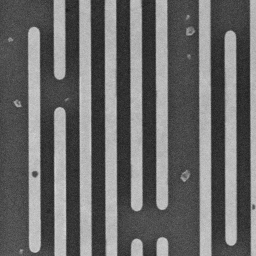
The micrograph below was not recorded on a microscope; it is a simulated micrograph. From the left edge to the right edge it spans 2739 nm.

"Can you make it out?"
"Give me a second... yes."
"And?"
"groups of lines, slits or small figures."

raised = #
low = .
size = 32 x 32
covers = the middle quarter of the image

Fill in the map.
....###...###....##....###......
....###...###....##....###......
....###...###....##....###......
....###...###....##....###......
....###...###....##....###......
....###...###....##....###......
....###...###....##....###......
....###...###....##....###......
....###...###....##....###......
....###...###....##....###......
....###...###....##....###......
....###...###....##....###......
....###...###....##....###......
....###...###....##....###......
....###...###....##....###......
....###...###....###...###......
....###....##....###...###......
....###....##....###...###......
....###....##....###...###......
....###....##....###...###......
....###....##....###...###......
....###....##....###...###......
....###....##....###...###......
....###....##....###...###......
....###....##....###...###......
....###....##....###...###......
....###....##....###...###......
....###....##....###...###......
....###....##....###...###......
....###....##....###...###......
....###....##....###...###......
....###....##....###...###......